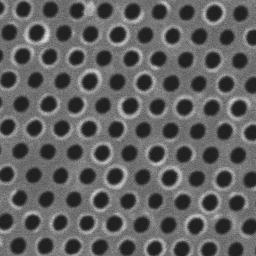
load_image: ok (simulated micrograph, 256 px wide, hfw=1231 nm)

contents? a regular array of holes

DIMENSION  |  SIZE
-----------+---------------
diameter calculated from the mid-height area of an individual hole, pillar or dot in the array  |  78.7 nm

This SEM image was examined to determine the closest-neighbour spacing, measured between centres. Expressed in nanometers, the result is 130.